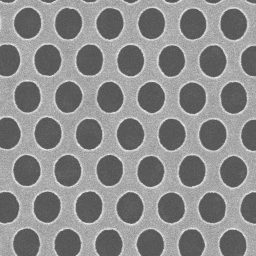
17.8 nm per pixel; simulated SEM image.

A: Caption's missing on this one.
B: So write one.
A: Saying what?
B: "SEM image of a regular array of holes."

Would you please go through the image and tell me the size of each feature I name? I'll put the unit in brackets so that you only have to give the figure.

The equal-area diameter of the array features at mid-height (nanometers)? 524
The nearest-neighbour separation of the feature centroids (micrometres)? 0.733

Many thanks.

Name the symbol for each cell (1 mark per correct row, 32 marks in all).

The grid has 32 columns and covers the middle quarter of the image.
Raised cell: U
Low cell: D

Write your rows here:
UUUDDDDDDDUUUDDDDDDDUUUUDDDDDDUU
UUUUDDDDDUUUUUDDDDDDUUUUDDDDDUUU
UUUUUDDDUUUUUUUDDDDUUUUUUDDDDUUU
UUUUUUUUUUUUUUUUUUUUUUUUUUUUUUUU
UDUUUUUUUUUDUUUUUUUUUDDUUUUUUUUU
DDDDUUUUUDDDDDUUUUUDDDDDUUUUUUDD
DDDDUUUUUDDDDDUUUUUDDDDDDUUUUDDD
DDDDDUUUDDDDDDDUUUUDDDDDDUUUUDDD
DDDDDUUUDDDDDDDUUUDDDDDDDUUUUDDD
DDDDUUUUDDDDDDDUUUUDDDDDDUUUUDDD
DDDDUUUUUDDDDDUUUUUDDDDDDUUUUDDD
DDDUUUUUUUDDDDUUUUUUDDDDUUUUUUDD
UUUUUUUUUUUUUUUUUUUUUUUUUUUUUUUD
UUUUUUUUUUUUUUUUDUUUUUUUUUUUUUUU
UUUUDDDDDUUUUUDDDDDUUUUUUDDDDUUU
UUUDDDDDDUUUUUDDDDDUUUUUDDDDDDUU
UUUDDDDDDUUUUDDDDDDDUUUUDDDDDDUU
UUUDDDDDDDUUUDDDDDDDUUUDDDDDDDDU
UUUDDDDDDDUUUDDDDDDDUUUUDDDDDDUU
UUUDDDDDDUUUUDDDDDDDUUUUDDDDDDUU
UUUUDDDDUUUUUUDDDDDUUUUUUDDDDUUU
UUUUUUDUUUUUUUUUDUUUUUUUUUDDUUUU
UUUUUUUUUUUUUUUUUUUUUUUUUUUUUUUU
DDDUUUUUUDDDDUUUUUUUDDDUUUUUUUDD
DDDDUUUUDDDDDDUUUUUDDDDDUUUUUDDD
DDDDUUUUDDDDDDDUUUDDDDDDDUUUUDDD
DDDDUUUUDDDDDDDUUUDDDDDDDUUUUDDD
DDDDUUUUDDDDDDDUUUDDDDDDDUUUUDDD
DDDDUUUUDDDDDDUUUUDDDDDDDUUUUDDD
DDDUUUUUUDDDDDUUUUUDDDDDUUUUUDDD
DDUUUUUUUUUDUUUUUUUUUDDUUUUUUUDD
UUUUUUUUUUUUUUUUUUUUUUUUUUUUUUUU